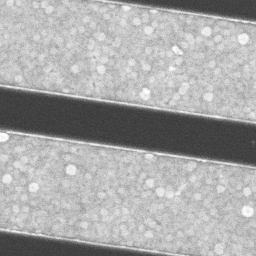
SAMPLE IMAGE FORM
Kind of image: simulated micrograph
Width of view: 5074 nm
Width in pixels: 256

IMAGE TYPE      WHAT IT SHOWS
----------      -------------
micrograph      one or a few lines or trenches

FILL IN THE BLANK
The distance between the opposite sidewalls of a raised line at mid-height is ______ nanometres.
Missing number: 900